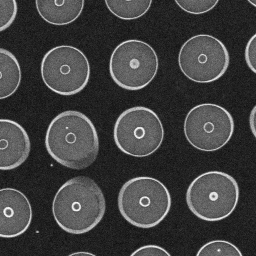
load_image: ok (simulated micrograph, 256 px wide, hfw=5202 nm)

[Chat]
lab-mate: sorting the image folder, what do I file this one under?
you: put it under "an array of small figures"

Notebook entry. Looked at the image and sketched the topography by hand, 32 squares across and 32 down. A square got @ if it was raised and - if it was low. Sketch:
--@@@--@--@@@------@@@-----@@@@@
--@@@-----@@@@----@@@@@@-@@@@@@@
-@@@@@---@@@@@@@@@@@@@@@@@@@@@@@
@@@@@@@@@@@@@@@@@@@@@@@@@@@@@@@@
@@@@@@@@@@@@@@@@@@@@@@@@@-@@@@@@
@@@@@@@@@@@@@@@---@@@@@-----@@@-
-@@@@@----@@@@-----@@@@-----@@@-
--@@@@-----@@@------@@---@--@@@-
--@@@---@--@@@------@@@-----@@@@
--@@@------@@@-----@@@@----@@@@@
--@@@@-----@@@@---@@@@@@@@@@@@@@
--@@@@@--@@@@@@@@@@@@@@@@@@@@@@@
@@@@@@@@@@@@@@@@@@@@@@@@@@@@@@@@
@@@@@@@@@@@@@@@@@@@@@@@@@---@@@@
@@@@@@@@--@@@@@----@@@@@-----@@@
--@@@@-----@@@@-----@@@------@@@
---@@@------@@---@--@@@------@@@
---@@@--@---@@@-----@@@@----@@@@
---@@@------@@@-----@@@@@--@@@@@
---@@@@----@@@@@@@@@@@@@@@@@@@@@
--@@@@@@@-@@@@@@@@@@@@@@@@@@@@@@
@@@@@@@@@@@@@@@@@@@@@@@@@@@@@@@@
@@@@@@@@@@@@@@@@@--@@@@@-----@@@
@@@@@@@@----@@@@-----@@@------@@
---@@@@-----@@@------@@@------@@
----@@@--@---@@------@@@-----@@@
----@@@------@@------@@@-----@@@
----@@@-----@@@@----@@@@@@@@@@@@
---@@@@@---@@@@@@@@@@@@@@@@@@@@@
@@@@@@@@@@@@@@@@@@@@@@@@@@@@@@@@
@@@@@@@@@@@@@@@@@@@@@@@@@@---@@@
@@@@@@@@@@@@@@@@@----@@@@-----@@